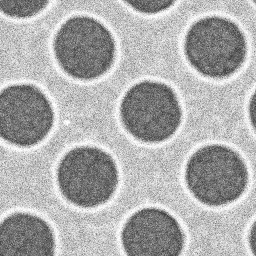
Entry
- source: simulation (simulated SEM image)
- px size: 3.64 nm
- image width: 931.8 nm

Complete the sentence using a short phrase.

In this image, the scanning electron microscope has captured holes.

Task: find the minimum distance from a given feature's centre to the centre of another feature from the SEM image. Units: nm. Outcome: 332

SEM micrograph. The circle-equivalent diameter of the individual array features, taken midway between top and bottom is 231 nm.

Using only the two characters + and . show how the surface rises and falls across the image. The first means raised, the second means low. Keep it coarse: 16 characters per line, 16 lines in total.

...+++++...+++++
++++..++++++...+
+++....+++++...+
+++....+++++...+
++++...+++++...+
..++++++...+++++
...+++++...+++++
...+++++...+++++
...+++++...+++++
++++...+++++...+
++++...+++++...+
++++...+++++...+
++++...+++++...+
..++++++...+++++
...+++++...+++++
...+++++...+++++